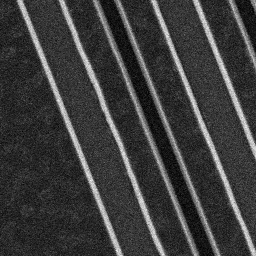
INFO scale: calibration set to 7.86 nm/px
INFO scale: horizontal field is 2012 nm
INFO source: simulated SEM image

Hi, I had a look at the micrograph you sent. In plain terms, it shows one or a few lines or trenches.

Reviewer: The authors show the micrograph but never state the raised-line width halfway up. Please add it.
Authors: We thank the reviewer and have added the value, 269 nanometres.